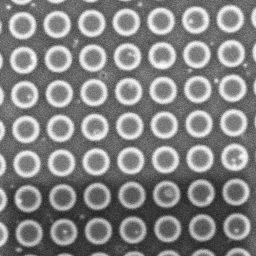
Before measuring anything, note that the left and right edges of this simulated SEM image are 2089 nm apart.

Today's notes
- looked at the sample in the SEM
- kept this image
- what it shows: an array of small figures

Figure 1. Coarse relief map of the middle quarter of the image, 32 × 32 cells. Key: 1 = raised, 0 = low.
10000111110000111100001111100000
00000011000000000000000000000000
00000000000000000000000000000000
00000000000000000000000011000000
00000011100000111100001111100001
10000111110001111110001111110011
11001111111001111110001111110011
11001111111001111110001111110011
11001111110001111110001111100001
10000111110000111100000111000000
00000000000000000000000000000000
00000000000000000000000000000000
00000000000000011000000011100000
10000111110000111110001111110001
11000111111001111110001111110001
11000111111001111111001111110001
11000111111001111111001111110001
11000111110000111110000111100000
10000011110000011100000001000000
00000000000000000000000000000000
00000000000000000000000000000000
00000001100000011100000111100000
11000111111000111110001111110001
11000111111000111111001111110001
11100111111000111111001111110001
11100111111000111111000111110001
11000111111000111110000111100000
10000001100000000000000000000000
00000000000000000000000000000000
00000000000000000000000001100000
10000011110000011110000111110000
11000111111000111111000111111001